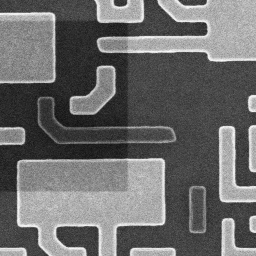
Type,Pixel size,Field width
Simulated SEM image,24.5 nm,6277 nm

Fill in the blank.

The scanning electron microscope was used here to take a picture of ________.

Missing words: wiring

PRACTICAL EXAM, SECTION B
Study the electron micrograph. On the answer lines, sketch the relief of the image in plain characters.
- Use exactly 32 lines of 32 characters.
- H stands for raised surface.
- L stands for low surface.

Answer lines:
LLLLLLLLLLLLHHLLHHLLHHHLLLHHHHHH
LLLLLLLLLLLLHHHHHHLLLHHHHHHHHHHH
HHHHHHHLLLLLHHHHHHLLLLHHHHHHHHHH
HHHHHHHLLLLLLLLLLLLLLLLLLLHHHHHH
HHHHHHHLLLLLLLLLLLLLLLLLLHHHHHHH
HHHHHHHLLLLLHHHHHHHHHHHHHHHHHHHH
HHHHHHHLLLLLLHHHHHHHLLLLLHHHHHHH
HHHHHHHLLLLLLLLLLLLLLLLLLLHHHHHH
HHHHHHHLLLLLHHLLLLLLLLLLLLLLLLLL
HHHHHHHLLLLLHHLLLLLLLLLLLLLLLLLL
LLLLLLLLLLLLHHLLLLLLLLLLLLLLLLLL
LLLLLLLLLLLHHHLLLLLLLLLLLLLLLLLL
LLLLLHHLLHHHHHLLLLLLLLLLLLLLLLLH
LLLLLHHLLHHHHLLLLLLLLLLLLLLLLLLH
LLLLLHHLLLLLLLLLLLLLLLLLLLLLLLLL
LLLLLHHHLLLLLLLLLLLLLLLLLLLLLLLL
HHHLLLHHHHHHHHHHHHHHHHLLLLLHHLLH
HHHLLLLHHHHHHHHHHHHHHHLLLLLHHLLH
LLLLLLLLLLLLLLLLLLLLLLLLLLLHHLLH
LLLLLLLLLLLLLLLLLLLLLLLLLLLHHLLH
LLHHHHHHHHHHHHHHHHHHHLLLLLLHHLLH
LLHHHHHHHHHHHHHHHHHHHLLLLLLHHLLL
LLHHHHHHHHHHHHHHHHHHHLLLLLLHHLLL
LLHHHHHHHHHHHHHHHHHHHLLLHLLHHHHH
LLHHHHHHHHHHHHHHHHHHHLLLHHLHHHHH
LLHHHHHHHHHHHHHHHHHHHLLLHHLLLLLL
LLHHHHHHHHHHHHHHHHHHHLLLHHLLLLLL
LLHHHHHHHHHHHHHHHHHHHLLLHHLLHLLH
LLLLLHHLLLLLHHHLLLLLLLLLHHLLHLLH
LLLLLHHLLLLLHHLLLLLLLLLLLLLLHLLL
LLLLLHHHLLLLHHLLLLLLLLLLLLLLHLLL
HHHLLLHHHHHLHHLLHHHHHHLLLLLLHHHH